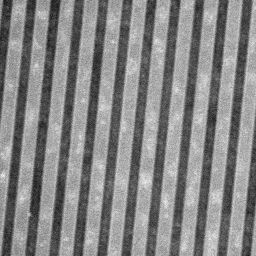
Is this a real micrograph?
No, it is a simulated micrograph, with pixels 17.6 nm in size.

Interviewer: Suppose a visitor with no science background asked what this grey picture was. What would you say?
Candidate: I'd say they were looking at parallel lines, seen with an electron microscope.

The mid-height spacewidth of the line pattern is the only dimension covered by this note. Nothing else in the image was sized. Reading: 10.7 px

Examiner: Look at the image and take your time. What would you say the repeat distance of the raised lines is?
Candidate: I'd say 420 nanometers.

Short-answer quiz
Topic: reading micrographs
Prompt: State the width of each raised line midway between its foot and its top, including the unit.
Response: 223 nanometers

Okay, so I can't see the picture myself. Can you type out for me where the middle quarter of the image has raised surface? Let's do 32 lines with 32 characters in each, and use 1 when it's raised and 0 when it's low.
10001110001110001110001110001110
10011110001110001110001110001110
10011110001110011110001110011110
00011110011100011110011100011110
00011100011100011100011100011110
00011100011100011100011100011100
00011100011100011100011100011100
00011100011100011100011100011100
00011100011100011100011100011100
00011100011100011100011100011100
00011100011100011100011100011100
00111100011100011100011100011100
00111100011100111100011100111100
00111100111000111100111000111100
00111000111000111000111000111100
00111000111000111000111000111000
00111000111000111000111000111000
00111000111000111000111000111000
00111000111000111000111000111000
00111000111000111000111000111000
00111000111000111000111000111000
01111000111000111000111000111000
01111000111001111000111001111000
01111001110001111001110001111001
01110001110001110001110001110001
01110001110001110001110001110001
01110001110001110001110001110001
01110001110001110001110001110001
01110001110001110001110001110001
01110001110001110001110001110001
01110001110001110001110001110001
11110001110001110001110001110001